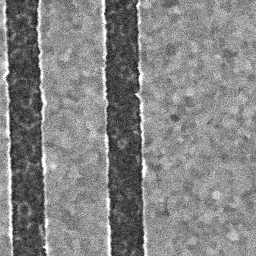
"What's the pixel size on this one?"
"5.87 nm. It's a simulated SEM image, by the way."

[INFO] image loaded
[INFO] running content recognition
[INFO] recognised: one or a few lines or trenches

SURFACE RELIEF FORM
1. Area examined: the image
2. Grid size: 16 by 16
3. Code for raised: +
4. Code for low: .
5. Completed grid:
..+++++..+++++++
..+++++..+++++++
..+++++..+++++++
..+++++..+++++++
...++++..+++++++
...++++..+++++++
+..++++..+++++++
+.+++++..+++++++
+.+++++..+++++++
+..++++..+++++++
+..++++..+++++++
+..++++..+++++++
+..++++..+++++++
+..++++..+++++++
+..++++..+++++++
+..++++..+++++++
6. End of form